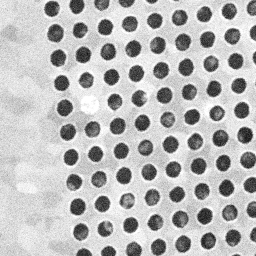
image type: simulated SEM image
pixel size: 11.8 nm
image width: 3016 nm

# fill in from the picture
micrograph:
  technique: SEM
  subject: a regular array of holes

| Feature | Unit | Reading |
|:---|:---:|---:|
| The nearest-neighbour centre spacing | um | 0.291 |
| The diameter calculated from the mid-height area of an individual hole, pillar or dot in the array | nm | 205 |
